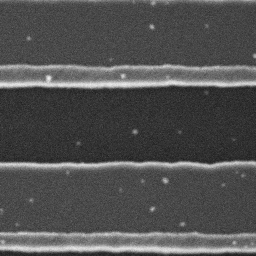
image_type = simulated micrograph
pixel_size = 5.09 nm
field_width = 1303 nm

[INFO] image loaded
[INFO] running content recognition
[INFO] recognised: lines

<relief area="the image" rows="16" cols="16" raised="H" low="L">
HHHHHHHHHHHHHHHH
HHHHHHHHHHHHHHHH
HHHHHHHHHHHHHHHH
HHHHHHHHHHHHHHHH
HHHHHHHHHHHHHHHH
LLLLLLLLLLLLLLLL
LLLLLLLLLLLLLLLL
LLLLLLLLLLLLLLLL
LLLLLLLLLLLLLLLL
LLLLLLLLLLLLLLLL
HHHHHHHHHHHHHHHH
HHHHHHHHHHHHHHHH
HHHHHHHHHHHHHHHH
HHHHHHHHHHHHHHHH
HHHHHHHHHHHHHHHH
HHHHHHHHHHHHHHHH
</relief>